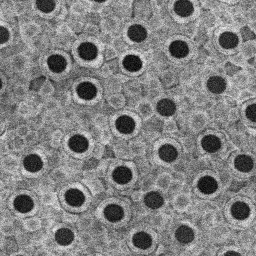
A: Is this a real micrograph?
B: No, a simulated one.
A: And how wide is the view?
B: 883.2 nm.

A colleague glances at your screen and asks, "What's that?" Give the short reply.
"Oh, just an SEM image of a regular array of holes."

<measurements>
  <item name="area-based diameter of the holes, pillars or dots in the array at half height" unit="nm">68.3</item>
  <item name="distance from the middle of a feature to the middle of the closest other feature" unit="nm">139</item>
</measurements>